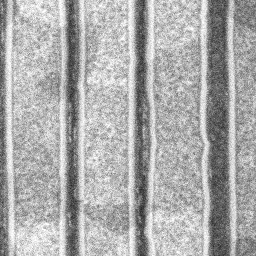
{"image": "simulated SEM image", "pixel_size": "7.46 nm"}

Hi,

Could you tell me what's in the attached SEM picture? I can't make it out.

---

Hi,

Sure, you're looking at one or a few lines or trenches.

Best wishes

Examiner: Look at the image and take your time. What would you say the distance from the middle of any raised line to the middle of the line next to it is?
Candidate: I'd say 527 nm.